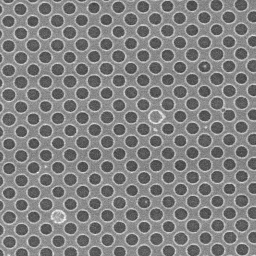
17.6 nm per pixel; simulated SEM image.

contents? a regular array of holes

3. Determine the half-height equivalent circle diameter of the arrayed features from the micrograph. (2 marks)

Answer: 218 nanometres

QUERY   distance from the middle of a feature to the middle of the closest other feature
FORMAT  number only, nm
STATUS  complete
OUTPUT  301